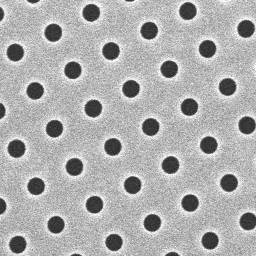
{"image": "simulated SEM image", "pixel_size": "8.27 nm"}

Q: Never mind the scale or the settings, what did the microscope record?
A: a regular array of holes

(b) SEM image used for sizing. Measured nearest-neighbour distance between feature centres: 353 nm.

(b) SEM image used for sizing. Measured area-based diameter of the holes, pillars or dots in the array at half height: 142 nm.